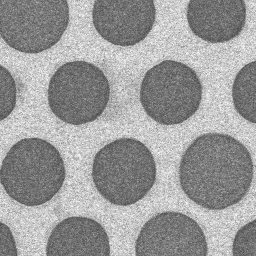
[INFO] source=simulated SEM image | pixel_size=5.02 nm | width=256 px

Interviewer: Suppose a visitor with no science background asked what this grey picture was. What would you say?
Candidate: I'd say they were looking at holes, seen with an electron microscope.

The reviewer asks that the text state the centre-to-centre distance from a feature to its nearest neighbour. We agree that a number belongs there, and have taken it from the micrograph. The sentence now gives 0.455 microns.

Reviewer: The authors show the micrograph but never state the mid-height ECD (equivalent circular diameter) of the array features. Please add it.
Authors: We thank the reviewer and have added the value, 323 nanometers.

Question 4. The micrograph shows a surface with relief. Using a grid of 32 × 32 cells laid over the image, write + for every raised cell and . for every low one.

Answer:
........++++.......+++++.......+
.........+++.......++++........+
.........+++.......++++........+
........++++.......+++++......++
........+++++.....+++++++.....++
+......+++++++...+++++++++++++++
+++..+++++++++++++++++++++++++++
++++++++++++++++++++++++++++++++
.++++++.....+++++++.....++++++..
.++++++......+++++.......+++++..
..++++........++++.......++++...
..++++........+++........++++...
..++++........++++.......++++...
..++++.......+++++.......++++...
.++++++.....+++++++.....++++++..
+++++++++.++++++++++..++++++++++
++++++++++++++++++++++++++++++++
+++...+++++++++..+++++++......++
+......++++++.....+++++........+
+.......++++.......++++........+
........++++.......++++.........
........+++........+++..........
........++++.......+++.........+
........++++.......++++........+
+......++++++.....+++++........+
+++..+++++++++...++++++++....+++
+++++++++++++++++++++.++++++++++
++++++++....+++++++.....++++++++
.++++++......+++++.......+++++..
..++++.......++++.........+++...
..++++........+++.........+++...
..++++........+++.........+++...